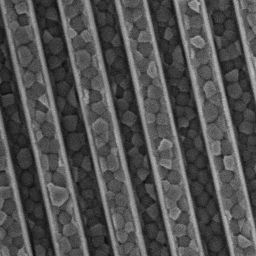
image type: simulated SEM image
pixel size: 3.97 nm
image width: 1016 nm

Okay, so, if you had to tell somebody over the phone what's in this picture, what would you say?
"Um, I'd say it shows parallel lines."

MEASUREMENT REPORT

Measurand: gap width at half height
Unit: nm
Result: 106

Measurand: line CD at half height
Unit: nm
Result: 117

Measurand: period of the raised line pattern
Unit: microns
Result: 0.224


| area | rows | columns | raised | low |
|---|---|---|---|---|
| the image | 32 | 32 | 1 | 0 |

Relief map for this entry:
11110001111000011100001111000111
11110000111000011110001111000011
01110000111100011110001111000011
01111000111100011110000111000011
01111000111100011110000111000011
01111000111100001110000111100011
01111000011110001111000111100001
00111100011110001111000111100001
00111100011110001111000011100001
00111100011110000111000011110001
00111100001110000111100011110000
00011100001111000111100011110000
00011110001111000111100001110000
00011110001111000011100001110000
00011110001111000011110001111000
00011110000111100011110001111000
10001111000111100011110001111000
10001111000111100011110000111000
10001111000111100001110000111100
10001111000011100001111000111100
10000111000011110001111000111100
11000111100011110001111000011100
11000111100011110000111000011100
11000111100001110000111100011110
11000111100001111000111100011110
11100011110001111000111100001110
11100011110001111000111100001110
11100011110001111000011100001111
11100011110000111000011110001111
11100001110000111100011110001111
11110001111000111100011110000111
11110001111000111100001110000111